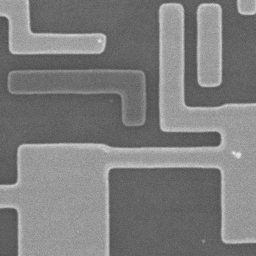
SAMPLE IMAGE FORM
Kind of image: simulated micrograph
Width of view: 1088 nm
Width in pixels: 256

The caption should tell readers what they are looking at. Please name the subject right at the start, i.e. wiring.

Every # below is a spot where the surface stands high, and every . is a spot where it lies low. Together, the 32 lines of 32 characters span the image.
###..................#........##
####................###..###..##
.###................###..###....
.###................###..###....
.############.......###..###....
.############.......###..###....
..###########.......###..###....
....................###..###....
....................###..###....
.#################..###..###....
.#################..###..##.....
.#################..###.........
...............###..###.........
...............###..############
...............###..############
................##..############
...........................#####
............................####
..############...........#######
..##############################
..##############################
..############..............####
..###########...............####
#############...............####
#############...............####
#############...............####
..############..............####
..############..............####
..############..............####
..############..............####
..############..................
..############..................